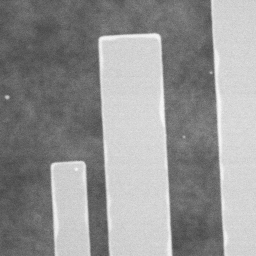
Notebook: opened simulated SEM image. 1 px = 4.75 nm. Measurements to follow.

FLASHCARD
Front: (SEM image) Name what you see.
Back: groups of lines, slits or small figures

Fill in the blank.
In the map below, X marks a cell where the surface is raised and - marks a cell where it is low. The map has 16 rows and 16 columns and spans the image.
-------------XXX
-------------XXX
-------XXX---XXX
------XXXX---XXX
------XXXX----XX
------XXXX----XX
------XXXX----XX
------XXXX----XX
------XXXX----XX
-------XXX----XX
---XX--XXX----XX
---XX--XXX----XX
---XX--XXXX---XX
---XX--XXXX---XX
---XXX-XXXX---XX
---XXX-XXXX---XX